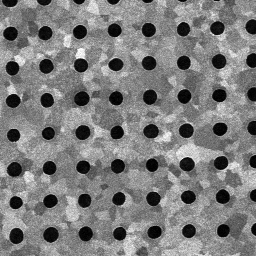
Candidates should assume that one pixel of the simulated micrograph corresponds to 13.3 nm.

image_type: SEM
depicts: a regular array of holes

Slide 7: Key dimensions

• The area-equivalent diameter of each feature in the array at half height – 191 nm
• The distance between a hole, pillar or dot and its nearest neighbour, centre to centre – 444 nm